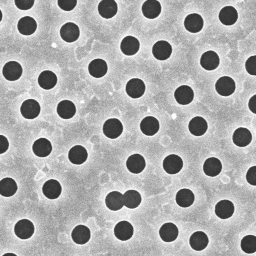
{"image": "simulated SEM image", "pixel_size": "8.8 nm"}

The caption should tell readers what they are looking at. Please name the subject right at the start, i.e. a regular array of holes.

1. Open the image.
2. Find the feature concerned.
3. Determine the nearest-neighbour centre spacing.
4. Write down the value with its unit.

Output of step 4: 320 nm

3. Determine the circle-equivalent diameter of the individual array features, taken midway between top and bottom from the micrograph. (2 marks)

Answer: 177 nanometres